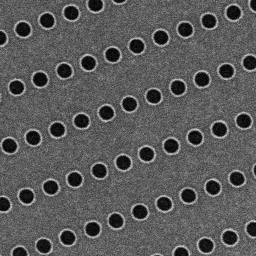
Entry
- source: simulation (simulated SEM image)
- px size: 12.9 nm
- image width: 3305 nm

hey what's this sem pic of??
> a regular array of raised bodies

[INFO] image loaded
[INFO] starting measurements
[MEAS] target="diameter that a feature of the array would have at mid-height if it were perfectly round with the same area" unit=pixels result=16.9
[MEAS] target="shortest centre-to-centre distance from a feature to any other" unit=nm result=327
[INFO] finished